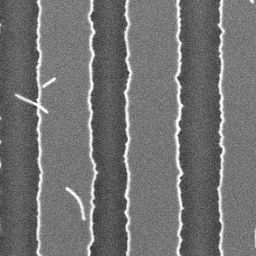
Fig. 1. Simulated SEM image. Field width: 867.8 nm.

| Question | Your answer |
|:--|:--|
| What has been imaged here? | lines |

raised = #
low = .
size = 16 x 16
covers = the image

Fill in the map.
..####..###...##
..####..###...##
..####..###...##
..####..###...##
..####..###...##
..####..###...##
..####..###...##
..####..###...##
..####..###...##
..####..###...##
..####..###...##
..####..###...##
..####..###...##
..####..###...##
..####..###...##
..####..###...##